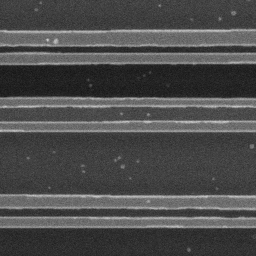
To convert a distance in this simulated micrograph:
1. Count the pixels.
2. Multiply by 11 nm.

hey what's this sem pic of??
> lines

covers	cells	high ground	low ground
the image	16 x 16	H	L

LLLLLLLLLLLLLLLL
LLLLLLLLLLLLLLLL
HHHHHHHHHHHHHHHH
HHHHHHHHHHHHHHHH
LLLLLLLLLLLLLLLL
LLLLLLLLLLLLLLLL
HHHHHHHHHHHHHHHH
HHHHHHHHHHHHHHHH
LLLLLLLLLLLLLLLL
LLLLLLLLLLLLLLLL
LLLLLLLLLLLLLLLL
LLLLLLLLLLLLLLLL
HHHHHHHHHHHHHHHH
HHHHHHHHHHHHHHHH
LLLLLLLLLLLLLLLL
LLLLLLLLLLLLLLLL